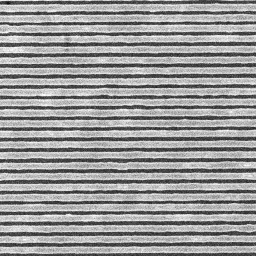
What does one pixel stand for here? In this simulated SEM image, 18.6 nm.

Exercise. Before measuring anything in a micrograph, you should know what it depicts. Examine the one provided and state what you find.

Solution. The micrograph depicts parallel lines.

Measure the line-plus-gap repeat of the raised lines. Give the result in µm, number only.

0.195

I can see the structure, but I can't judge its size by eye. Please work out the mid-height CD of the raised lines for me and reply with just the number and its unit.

0.116 microns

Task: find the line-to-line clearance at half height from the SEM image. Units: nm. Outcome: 81.2